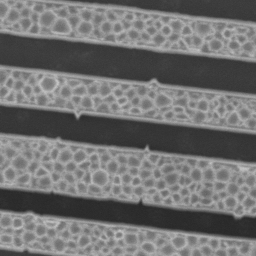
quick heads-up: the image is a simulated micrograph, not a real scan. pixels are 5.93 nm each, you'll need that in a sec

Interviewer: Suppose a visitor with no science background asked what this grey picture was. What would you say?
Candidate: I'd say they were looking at one or a few lines or trenches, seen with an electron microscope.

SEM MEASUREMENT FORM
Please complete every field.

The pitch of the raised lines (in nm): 433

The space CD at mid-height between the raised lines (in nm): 180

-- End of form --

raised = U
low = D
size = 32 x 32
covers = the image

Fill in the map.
UUUUUUUUUUDDDDDDDDDDDDDDDDDDDDDD
UUUUUUUUUUUUUUUUUUUUDDDDDDDDDDDD
UUUUUUUUUUUUUUUUUUUUUUUUUUUDDDDD
UUUUUUUUUUUUUUUUUUUUUUUUUUUUUUUU
DDDDUUUUUUUUUUUUUUUUUUUUUUUUUUUU
DDDDDDDDDDDDDDUUUUUUUUUUUUUUUUUU
DDDDDDDDDDDDDDDDDDDDDDDUUUUUUUUU
DDDDDDDDDDDDDDDDDDDDDDDDDDDDDDDU
UDDDDDDDDDDDDDDDDDDDDDDDDDDDDDDD
UUUUUUUUUUDDDDDDDDDDDDDDDDDDDDDD
UUUUUUUUUUUUUUUUUUUUDDDDDDDDDDDD
UUUUUUUUUUUUUUUUUUUUUUUUUUUDDDDD
UUUUUUUUUUUUUUUUUUUUUUUUUUUUUUUU
DDDDDUUUUUUUUUUUUUUUUUUUUUUUUUUU
DDDDDDDDDDDDDDUUUUUUUUUUUUUUUUUU
DDDDDDDDDDDDDDDDDDDDDDDUUUUUUUUU
DDDDDDDDDDDDDDDDDDDDDDDDDDDDDDDU
UUUUUUDUDDDDDDDDDDDDDDDDDDDDDDDD
UUUUUUUUUUUUUUUDDDDDDDDDDDDDDDDD
UUUUUUUUUUUUUUUUUUUUUUUDDDDDDDDD
UUUUUUUUUUUUUUUUUUUUUUUUUUUUUUUD
UUUUUUUUUUUUUUUUUUUUUUUUUUUUUUUU
UUUUUUUUUUUUUUUUUUUUUUUUUUUUUUUU
DUUUUUUUUUUUUUUUUUUUUUUUUUUUUUUU
DDDDDDDDDDUUUUUUUUUUUUUUUUUUUUUU
DDDDDDDDDDDDDDDDDDUUUUUUUUUUUUUU
UDDDDDDDDDDDDDDDDDDDDDDDDDDDUUUU
UUUUUUUUUUDDDDDDDDDDDDDDDDDDDDDD
UUUUUUUUUUUUUUUUUUDDDDDDDDDDDDDD
UUUUUUUUUUUUUUUUUUUUUUUUUUUDDDDD
UUUUUUUUUUUUUUUUUUUUUUUUUUUUUUUU
DDDDDUUUUUUUUUUUUUUUUUUUUUUUUUUU